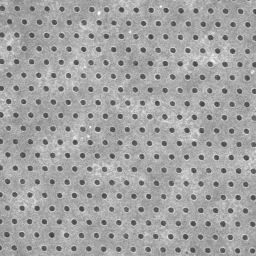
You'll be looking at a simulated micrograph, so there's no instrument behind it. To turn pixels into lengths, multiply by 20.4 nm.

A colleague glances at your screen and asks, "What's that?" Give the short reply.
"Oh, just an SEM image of a regular array of holes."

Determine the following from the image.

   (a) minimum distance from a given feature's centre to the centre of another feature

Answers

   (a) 14.8 px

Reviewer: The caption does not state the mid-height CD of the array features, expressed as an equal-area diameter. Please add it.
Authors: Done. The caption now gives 122 nm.